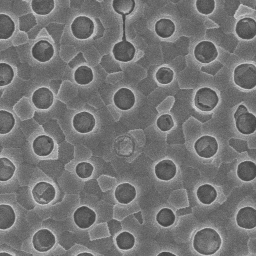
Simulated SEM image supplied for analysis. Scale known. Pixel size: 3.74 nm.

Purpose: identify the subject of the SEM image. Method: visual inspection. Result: a regular array of holes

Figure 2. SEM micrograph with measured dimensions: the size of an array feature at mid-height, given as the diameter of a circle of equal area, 0.0807 um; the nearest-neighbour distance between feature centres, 175 nanometers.